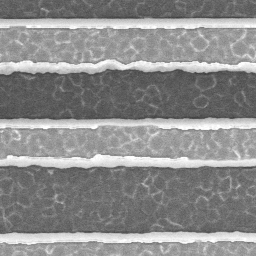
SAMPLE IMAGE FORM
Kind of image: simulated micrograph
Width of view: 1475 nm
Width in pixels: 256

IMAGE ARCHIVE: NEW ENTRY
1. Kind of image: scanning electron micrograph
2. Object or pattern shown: one or a few lines or trenches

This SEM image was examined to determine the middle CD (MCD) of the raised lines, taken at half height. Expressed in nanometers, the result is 252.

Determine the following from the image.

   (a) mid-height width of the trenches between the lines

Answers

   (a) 62.9 pixels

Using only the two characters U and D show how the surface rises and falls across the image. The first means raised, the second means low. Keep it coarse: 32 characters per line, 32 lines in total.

DDDDDDDDDDDDDDDDDDDDDDDDDDDDDDDD
DDDDDDDDDDDDDDDDDDDDDDDDDDDDDDDD
DDDDDDDDDDDDDDDDDDDDDDDDDDDDDDDD
UUUUUUUUUUUUUUUUUUUUUUUUUUUUUUUU
UUUUUUUUUUUUUUUUUUUUUUUUUUUUUUUU
UUUUUUUUUUUUUUUUUUUUUUUUUUUUUUUU
UUUUUUUUUUUUUUUUUUUUUUUUUUUUUUUU
UUUUUUUUUUUUUUUUUUUUUUUUUUUUUUUU
UUUUUUUUUUUUUDUUDUUUDUDUUUUUUUUU
DDDDDDDDDDDDDDDDDDDDDDDDDDDDDDDD
DDDDDDDDDDDDDDDDDDDDDDDDDDDDDDDD
DDDDDDDDDDDDDDDDDDDDDDDDDDDDDDDD
DDDDDDDDDDDDDDDDDDDDDDDDDDDDDDDD
DDDDDDDDDDDDDDDDDDDDDDDDDDDDDDDD
DDDDDDDDDDDDDDDDDDDDDDDDDDDDDDDD
UUUUUUUUUUUUUUUUUUUUUUUUUUUUUUUU
UUUUUUUUUUUUUUUUUUUUUUUUUUUUUUUU
UUUUUUUUUUUUUUUUUUUUUUUUUUUUUUUU
UUUUUUUUUUUUUUUUUUUUUUUUUUUUUUUU
UUUUUUUUUUUUUUUUUUUUUUUUUUUUUUUU
DDDDDDUUUDUUDDDDDDDUUDUUUDDDDDDD
DDDDDDDDDDDDDDDDDDDDDDDDDDDDDDDD
DDDDDDDDDDDDDDDDDDDDDDDDDDDDDDDD
DDDDDDDDDDDDDDDDDDDDDDDDDDDDDDDD
DDDDDDDDDDDDDDDDDDDDDDDDDDDDDDDD
DDDDDDDDDDDDDDDDDDDDDDDDDDDDDDDD
DDDDDDDDDDDDDDDDDDDDDDDDDDDDDDDD
DDDDDDDDDDDDDDDDDDDDDDDDDDDDDDDD
DDDDDDDDDDDDDDDDDDDDDDDDDDDDDDDD
DDDDDDDDDUUUUDDDUDUUUUUUUUUUUUUU
UUUUUUUUUUUUUUUUUUUUUUUUUUUUUUUU
UUUUUUUUUUUUUUUUUUUUUUUUUUUUUUUU